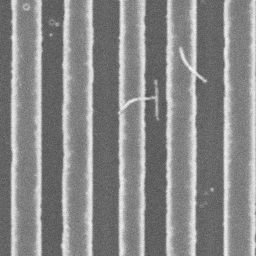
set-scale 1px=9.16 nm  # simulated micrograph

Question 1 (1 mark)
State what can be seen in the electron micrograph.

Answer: lines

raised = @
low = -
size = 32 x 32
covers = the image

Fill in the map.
--@@@---@@@----@@@---@@@----@@@@
--@@@---@@@----@@@---@@@----@@@@
--@@@---@@@----@@@---@@@----@@@@
--@@@---@@@----@@@---@@@----@@@@
--@@@---@@@----@@@---@@@----@@@@
--@@@---@@@----@@@---@@@----@@@@
--@@@---@@@----@@@---@@@----@@@@
--@@@---@@@----@@@---@@@----@@@@
--@@@---@@@----@@@---@@@----@@@@
--@@@---@@@----@@@---@@@@---@@@@
--@@@---@@@----@@@---@@@----@@@@
--@@@---@@@----@@@---@@@----@@@@
--@@@---@@@----@@@---@@@----@@@@
--@@@---@@@----@@@---@@@----@@@@
-@@@@---@@@----@@@---@@@----@@@@
--@@@---@@@----@@@---@@@----@@@@
--@@@---@@@----@@@---@@@----@@@@
--@@@---@@@----@@@---@@@----@@@@
--@@@---@@@----@@@---@@@----@@@@
--@@@---@@@----@@@---@@@----@@@@
--@@@---@@@----@@@---@@@----@@@@
--@@@---@@@----@@@---@@@----@@@@
-@@@@---@@@----@@@---@@@----@@@@
-@@@@---@@@----@@@---@@@----@@@@
-@@@@---@@@----@@@---@@@----@@@@
-@@@@---@@@----@@@---@@@----@@@@
-@@@@---@@@----@@@---@@@----@@@@
-@@@@---@@@----@@@---@@@----@@@@
--@@@---@@@----@@@---@@@----@@@@
-@@@@---@@@----@@@---@@@----@@@@
--@@@---@@@----@@@---@@@----@@@@
-@@@@---@@@----@@@---@@@----@@@@